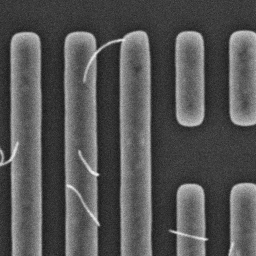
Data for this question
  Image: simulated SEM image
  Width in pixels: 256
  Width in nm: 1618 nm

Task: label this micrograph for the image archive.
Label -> wiring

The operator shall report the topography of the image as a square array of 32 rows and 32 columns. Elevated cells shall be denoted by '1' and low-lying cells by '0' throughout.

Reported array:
00000000000000000000000000000000
00000000000000000000000000000000
00000000000000000000000000000000
00000000000000000000000000000000
00110000011000001100001110000111
00111000111100011100001110000111
00111000111100011110001110000111
00111000111100011110001110000111
00111000111100011110001110000111
00111000111100011110001110000111
00111000111100011110001110000111
00111000111100011110001110000111
00111000111100011110001110000111
00111000111100011110001110000111
00111000111100011110001110000111
00111000111100011110000110000010
00111000111100011110000000000000
00111000111100011110000000000000
00111000111100011110000000000000
01111000111100011110000000000000
00111000111100011110000000000000
00111000111100011110000000000000
00111000111100011110000000000000
00111000111100011110000110000111
00111000111100011110001110000111
00111000111100011110001110000111
00111000111100011110001110000111
00111000111100011110001110000111
00111000111100011110001110000111
00111000111100011110001111000111
00111000111100011110001110000111
00111000111100011110001110000111